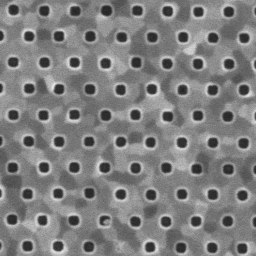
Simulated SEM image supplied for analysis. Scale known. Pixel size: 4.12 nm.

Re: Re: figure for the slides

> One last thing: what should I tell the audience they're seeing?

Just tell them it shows a regular array of holes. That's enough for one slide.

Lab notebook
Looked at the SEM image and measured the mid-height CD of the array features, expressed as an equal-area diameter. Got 48.8 nm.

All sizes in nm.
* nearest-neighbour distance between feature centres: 123